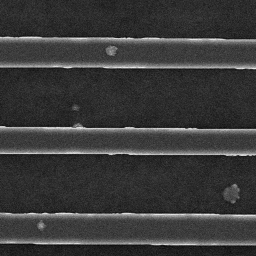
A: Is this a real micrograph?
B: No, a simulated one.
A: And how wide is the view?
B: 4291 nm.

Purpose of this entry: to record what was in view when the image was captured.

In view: lines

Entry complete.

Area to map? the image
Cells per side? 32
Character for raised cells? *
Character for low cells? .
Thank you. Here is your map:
................................
................................
................................
................................
................................
********************************
********************************
********************************
...............................*
................................
................................
................................
................................
................................
................................
................................
********************************
********************************
********************************
................................
................................
................................
................................
................................
................................
................................
................................
********************************
********************************
********************************
....................************
................................